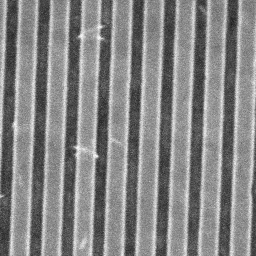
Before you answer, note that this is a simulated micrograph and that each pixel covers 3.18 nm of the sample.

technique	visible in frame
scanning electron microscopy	parallel lines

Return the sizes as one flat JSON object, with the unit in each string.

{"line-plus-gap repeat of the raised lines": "100 nanometres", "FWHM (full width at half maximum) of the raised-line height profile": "57.2 nm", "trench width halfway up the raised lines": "42.1 nm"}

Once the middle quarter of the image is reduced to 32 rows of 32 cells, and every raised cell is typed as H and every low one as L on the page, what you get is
LLLLHHHHLLLLHHHHLLLLHHHHLLLLHHHH
HLLLHHHHLLLLHHHHLLLLHHHHLLLLHHHH
HLLLHHHHLLLLHHHHLLLLHHHHLLLLHHHH
HLLLHHHHLLLLHHHHLLLLHHHHLLLLHHHH
LLLLHHHHLLLLHHHHLLLLHHHHLLLLHHHH
LLLLHHHHLLLLHHHHLLLLHHHHLLLLHHHH
LLLLHHHHLLLLHHHHLLLLHHHHLLLLHHHH
LLLLHHHHLLLLHHHHLLLLHHHHLLLLHHHH
LLLLHHHHLLLLHHHHLLLLHHHHLLLLHHHH
LLLLHHHHLLLLHHHHLLLLHHHHLLLHHHHL
LLLLHHHHLLLLHHHHLLLLHHHHLLLHHHHL
LLLLHHHHLLLLHHHHLLLLHHHHLLLHHHHL
LLLLHHHHLLLLHHHHLLLLHHHHLLLHHHHL
LLLLHHHHLLLHHHHHLLLLHHHHLLLHHHHL
LLLLHHHHLLLHHHHHLLLHHHHHLLLHHHHH
LLLLHHHHLLLHHHHHLLLHHHHLLLLHHHHH
LLLLHHHHLLLHHHHHLLLHHHHLLLLHHHHL
LLLLHHHHLLLHHHHHLLLHHHHLLLLHHHHL
LLLLHHHHLLLHHHHHLLLHHHHLLLLHHHHL
LLLLHHHHLLLHHHHHLLLHHHHLLLLHHHHL
LLLHHHHHLLLHHHHHLLLHHHHLLLLHHHHL
LLLHHHHHLLLHHHHLLLLHHHHLLLLHHHHL
LLLHHHHHLLLHHHHLLLLHHHHLLLLHHHHL
LLLLHHHHLLLHHHHLLLLHHHHLLLLHHHHL
LLLLHHHHLLLHHHHLLLLHHHHLLLLHHHHL
LLLHHHHHLLLHHHHLLLLHHHHLLLLHHHHL
LLLHHHHLLLLHHHHLLLLHHHHLLLLHHHHL
LLLHHHHLLLLHHHHLLLLHHHHLLLLHHHHL
LLLHHHHLLLLHHHHLLLLHHHHLLLLHHHHL
LLLHHHHLLLLHHHHLLLLHHHHLLLLHHHHL
LLLHHHHLLLLHHHHLLLLHHHHLLLLHHHHL
LLLHHHHLLLLHHHHLLLLHHHHLLLLHHHHL